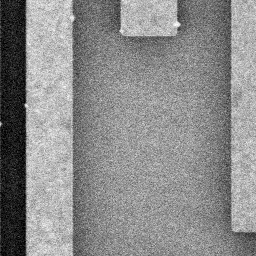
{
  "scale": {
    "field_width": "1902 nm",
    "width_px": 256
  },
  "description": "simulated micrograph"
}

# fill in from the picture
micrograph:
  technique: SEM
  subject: groups of lines, slits or small figures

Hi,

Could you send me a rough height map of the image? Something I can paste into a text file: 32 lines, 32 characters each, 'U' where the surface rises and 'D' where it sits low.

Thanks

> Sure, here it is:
DDDUUUUUUDDDDDDUUUUUUUDDDDDDDUUU
DDDUUUUUUDDDDDDUUUUUUUDDDDDDDUUU
DDDUUUUUUDDDDDDUUUUUUUDDDDDDDUUU
DDDUUUUUUDDDDDDUUUUUUUDDDDDDDUUU
DDDUUUUUUDDDDDDDDDDDDDDDDDDDDUUU
DDDUUUUUUDDDDDDDDDDDDDDDDDDDDUUU
DDDUUUUUUDDDDDDDDDDDDDDDDDDDDUUU
DDDUUUUUUDDDDDDDDDDDDDDDDDDDDUUU
DDDUUUUUUDDDDDDDDDDDDDDDDDDDDUUU
DDDUUUUUUDDDDDDDDDDDDDDDDDDDDUUU
DDDUUUUUUDDDDDDDDDDDDDDDDDDDDUUU
DDDUUUUUUDDDDDDDDDDDDDDDDDDDDUUU
DDDUUUUUUDDDDDDDDDDDDDDDDDDDDUUU
DDDUUUUUUDDDDDDDDDDDDDDDDDDDDUUU
DDDUUUUUUDDDDDDDDDDDDDDDDDDDDUUU
DDDUUUUUUDDDDDDDDDDDDDDDDDDDDUUU
DDDUUUUUUDDDDDDDDDDDDDDDDDDDDUUU
DDDUUUUUUDDDDDDDDDDDDDDDDDDDDUUU
DDDUUUUUUDDDDDDDDDDDDDDDDDDDDUUU
DDDUUUUUUDDDDDDDDDDDDDDDDDDDDUUU
DDDUUUUUUDDDDDDDDDDDDDDDDDDDDUUU
DDDUUUUUUDDDDDDDDDDDDDDDDDDDDUUU
DDDUUUUUUDDDDDDDDDDDDDDDDDDDDUUU
DDDUUUUUUDDDDDDDDDDDDDDDDDDDDUUU
DDDUUUUUUDDDDDDDDDDDDDDDDDDDDUUU
DDDUUUUUUDDDDDDDDDDDDDDDDDDDDUUU
DDDUUUUUUDDDDDDDDDDDDDDDDDDDDUUU
DDDUUUUUUDDDDDDDDDDDDDDDDDDDDUUU
DDDUUUUUUDDDDDDDDDDDDDDDDDDDDUUU
DDDUUUUUUDDDDDDDDDDDDDDDDDDDDDDD
DDDUUUUUUDDDDDDDDDDDDDDDDDDDDDDD
DDDUUUUUUDDDDDDDDDDDDDDDDDDDDDDD